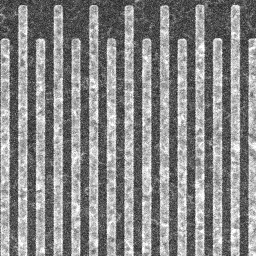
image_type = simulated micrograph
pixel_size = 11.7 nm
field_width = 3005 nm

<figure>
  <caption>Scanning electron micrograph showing parallel lines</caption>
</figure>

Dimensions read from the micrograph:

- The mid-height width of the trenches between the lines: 110 nanometers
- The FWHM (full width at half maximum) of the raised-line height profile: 99.8 nm